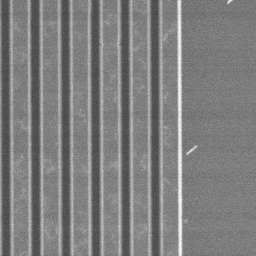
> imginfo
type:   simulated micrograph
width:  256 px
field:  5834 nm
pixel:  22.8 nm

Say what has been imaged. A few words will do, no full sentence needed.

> parallel lines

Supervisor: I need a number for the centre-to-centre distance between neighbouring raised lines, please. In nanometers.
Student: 682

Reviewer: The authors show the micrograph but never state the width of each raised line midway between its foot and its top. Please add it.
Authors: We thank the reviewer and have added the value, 0.436 µm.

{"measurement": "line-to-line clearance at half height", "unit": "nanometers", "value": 242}